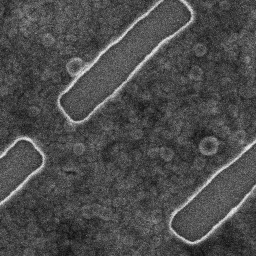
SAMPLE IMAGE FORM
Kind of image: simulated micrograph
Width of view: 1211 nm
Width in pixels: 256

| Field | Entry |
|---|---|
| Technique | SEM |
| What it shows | holes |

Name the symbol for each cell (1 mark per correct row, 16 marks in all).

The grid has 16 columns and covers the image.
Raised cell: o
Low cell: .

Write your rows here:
oooooooooo..oooo
oooooooo....oooo
ooooooo...oooooo
oooooo...ooooooo
ooooo...oooooooo
oooo...ooooooooo
oooo..oooooooooo
oooooooooooooooo
oooooooooooooooo
..ooooooooooooo.
..oooooooooooo..
.oooooooooooo...
oooooooooooo...o
ooooooooooo...oo
ooooooooooo..ooo
oooooooooooooooo